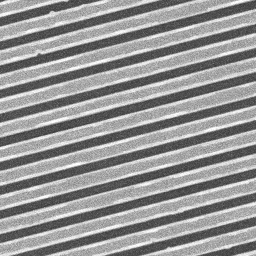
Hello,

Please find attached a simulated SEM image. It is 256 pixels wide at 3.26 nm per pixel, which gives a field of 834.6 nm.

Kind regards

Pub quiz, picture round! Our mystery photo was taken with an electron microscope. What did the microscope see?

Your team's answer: parallel lines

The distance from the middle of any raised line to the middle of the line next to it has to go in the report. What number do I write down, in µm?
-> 0.0761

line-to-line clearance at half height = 31.9 nanometers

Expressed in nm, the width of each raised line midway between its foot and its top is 45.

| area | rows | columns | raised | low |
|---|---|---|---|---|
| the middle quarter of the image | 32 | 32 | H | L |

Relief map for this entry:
HHHHHHLLLLLLLLLLLHHHHHHHHHHHHLLL
HHLLLLLLLLLLLHHHHHHHHHHHHHLLLLLL
LLLLLLLLHHHHHHHHHHHHHHLLLLLLLLLL
LLLLHHHHHHHHHHHHHHLLLLLLLLLLHHHH
HHHHHHHHHHHHHHLLLLLLLLLLHHHHHHHH
HHHHHHHHHHLLLLLLLLLLHHHHHHHHHHHH
HHHHHHLLLLLLLLLLHHHHHHHHHHHHHHLL
HHLLLLLLLLLLHHHHHHHHHHHHHHLLLLLL
LLLLLLLLHHHHHHHHHHHHHHLLLLLLLLLL
LLLLLHHHHHHHHHHHHHLLLLLLLLLLHHHH
LHHHHHHHHHHHHHLLLLLLLLLLHHHHHHHH
HHHHHHHHHHLLLLLLLLLLLHHHHHHHHHHH
HHHHHHHLLLLLLLLLLHHHHHHHHHHHHHLL
HHHLLLLLLLLLLHHHHHHHHHHHHHLLLLLL
LLLLLLLLLHHHHHHHHHHHHHLLLLLLLLLL
LLLLLHHHHHHHHHHHHHHLLLLLLLLLLHHH
LHHHHHHHHHHHHHHLLLLLLLLLLHHHHHHH
HHHHHHHHHHHLLLLLLLLLLHHHHHHHHHHH
HHHHHHHLLLLLLLLLLHHHHHHHHHHHHHLL
HHHLLLLLLLLLLHHHHHHHHHHHHHLLLLLL
LLLLLLLLLHHHHHHHHHHHHHLLLLLLLLLL
LLLLLHHHHHHHHHHHHHLLLLLLLLLLHHHH
LHHHHHHHHHHHHHLLLLLLLLLLHHHHHHHH
HHHHHHHHHHLLLLLLLLLLHHHHHHHHHHHH
HHHHHHLLLLLLLLLLHHHHHHHHHHHHHHLL
HHLLLLLLLLLLLLHHHHHHHHHHHHLLLLLL
LLLLLLLLLHHHHHHHHHHHHHLLLLLLLLLL
LLLLLHHHHHHHHHHHHHLLLLLLLLLLHHHH
LHHHHHHHHHHHHHLLLLLLLLLLLHHHHHHH
HHHHHHHHHHHLLLLLLLLLLHHHHHHHHHHH
HHHHHHHLLLLLLLLLLHHHHHHHHHHHHHLL
HHHLLLLLLLLLLHHHHHHHHHHHHHHLLLLL